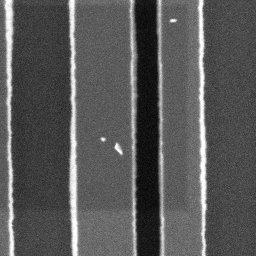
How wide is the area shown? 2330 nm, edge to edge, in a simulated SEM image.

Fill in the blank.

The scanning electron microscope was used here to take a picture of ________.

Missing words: lines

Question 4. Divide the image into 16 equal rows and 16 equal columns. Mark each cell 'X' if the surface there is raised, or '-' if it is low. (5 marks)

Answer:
-----XXX--XXX---
X----XXX--XXX---
X----XXX--XXX---
X----XXX--XXX---
X----XXX--XXX---
X----XXX--XXX---
X----XXX--XXX---
X----XXX--XXX---
X----XXX--XXX---
X----XXX--XXX---
X----XXX--XXX---
X----XXX--XXX---
X----XXX--XXX---
X----XXX--XXX---
X----XXX--XXX---
X----XXX--XXX---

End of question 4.